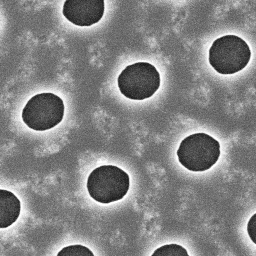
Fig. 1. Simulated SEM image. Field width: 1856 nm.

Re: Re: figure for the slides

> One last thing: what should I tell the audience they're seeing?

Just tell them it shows holes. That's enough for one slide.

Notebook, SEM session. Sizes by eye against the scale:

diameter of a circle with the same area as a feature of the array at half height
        300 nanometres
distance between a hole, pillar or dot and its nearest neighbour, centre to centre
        682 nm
